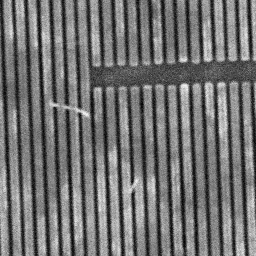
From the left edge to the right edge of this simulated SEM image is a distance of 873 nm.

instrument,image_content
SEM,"parallel lines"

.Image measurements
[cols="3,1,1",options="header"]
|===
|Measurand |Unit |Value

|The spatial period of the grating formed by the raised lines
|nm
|42.1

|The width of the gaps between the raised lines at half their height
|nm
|17.4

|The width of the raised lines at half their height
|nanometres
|26.4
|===